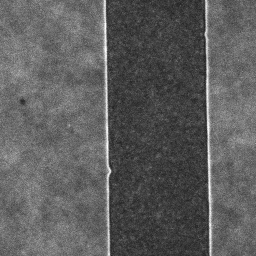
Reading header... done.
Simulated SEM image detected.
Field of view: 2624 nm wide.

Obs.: one or a few lines or trenches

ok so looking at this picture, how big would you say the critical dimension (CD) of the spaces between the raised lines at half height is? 1030 nm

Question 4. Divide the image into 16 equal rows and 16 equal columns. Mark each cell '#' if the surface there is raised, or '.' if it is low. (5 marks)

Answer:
#######......###
#######......###
#######......###
#######......###
#######......###
#######......###
#######......###
#######......###
#######......###
#######......###
#######......###
#######......###
#######......###
#######......###
#######......###
#######......###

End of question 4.